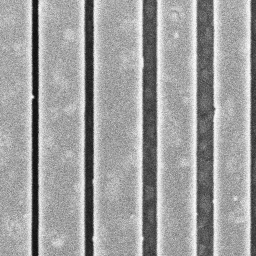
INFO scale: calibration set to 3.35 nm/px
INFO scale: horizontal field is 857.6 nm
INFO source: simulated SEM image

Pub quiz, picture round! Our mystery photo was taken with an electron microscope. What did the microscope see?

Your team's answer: parallel lines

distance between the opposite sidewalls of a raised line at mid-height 143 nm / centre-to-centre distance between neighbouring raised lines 190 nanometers